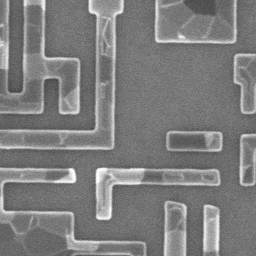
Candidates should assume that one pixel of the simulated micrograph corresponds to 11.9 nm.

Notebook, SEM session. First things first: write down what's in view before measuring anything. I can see wiring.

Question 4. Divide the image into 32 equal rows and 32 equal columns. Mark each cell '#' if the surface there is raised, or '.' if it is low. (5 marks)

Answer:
#..###.....####.....#########...
#..###.....####.....#########...
#..###......##.....##########...
#..###......##.....##########...
#..##.......##.....##########...
#..##.......##..................
#..##.......##..................
#..#######..##...............###
#..#######..##...............###
#..#######..##...............###
#..##..###..##................##
#..##..###..##................##
#####..###..##................##
#####..###..##................##
............##..................
............##..................
##############.......##.........
##############.......#######..##
##.###########.......#######..##
..............................##
..............................##
#########...###############...##
#########...###############...##
............##..................
............##..................
............##.......##.........
#####.......##.......##...#.....
#########............##...#.....
#########............##...#.....
#########............##...#.....
##################...##...#.....
##################...##...#.....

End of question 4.